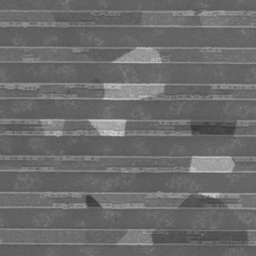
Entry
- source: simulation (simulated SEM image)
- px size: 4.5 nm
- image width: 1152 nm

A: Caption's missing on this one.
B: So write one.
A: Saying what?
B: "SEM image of parallel lines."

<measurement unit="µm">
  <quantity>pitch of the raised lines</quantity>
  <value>0.164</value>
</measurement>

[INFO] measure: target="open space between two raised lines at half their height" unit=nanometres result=97.9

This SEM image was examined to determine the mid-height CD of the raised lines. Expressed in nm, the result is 64.1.